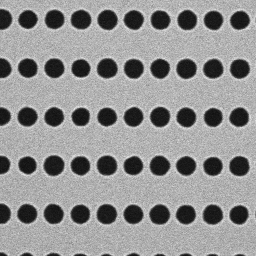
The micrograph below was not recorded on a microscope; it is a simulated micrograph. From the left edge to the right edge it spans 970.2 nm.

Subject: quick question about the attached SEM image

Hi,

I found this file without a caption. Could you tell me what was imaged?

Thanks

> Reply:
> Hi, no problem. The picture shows a regular array of holes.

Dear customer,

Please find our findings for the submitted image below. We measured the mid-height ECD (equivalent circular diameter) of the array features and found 73.1 nm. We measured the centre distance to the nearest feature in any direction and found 100 nanometres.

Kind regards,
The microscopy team